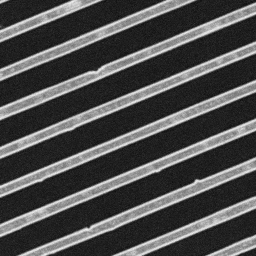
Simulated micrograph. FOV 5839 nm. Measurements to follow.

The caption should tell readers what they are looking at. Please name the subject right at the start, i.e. parallel lines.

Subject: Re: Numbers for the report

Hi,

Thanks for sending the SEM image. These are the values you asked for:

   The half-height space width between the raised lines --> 617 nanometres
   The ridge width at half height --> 200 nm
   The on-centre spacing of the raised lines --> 819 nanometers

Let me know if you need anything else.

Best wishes